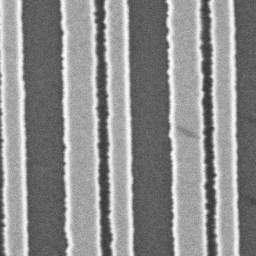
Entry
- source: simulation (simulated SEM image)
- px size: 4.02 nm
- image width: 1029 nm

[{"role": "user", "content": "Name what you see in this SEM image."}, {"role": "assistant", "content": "lines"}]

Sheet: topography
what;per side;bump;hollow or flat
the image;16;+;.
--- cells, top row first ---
+...++++...++++.
+...++++...++++.
+...++++...++++.
+...++++...++++.
+...++++...++++.
+...++++...++++.
+...++++...++++.
+...++++...++++.
++..++++...++++.
++..++++...++++.
++..++++...++++.
++..++++...++++.
++..++++...++++.
++..++++...++++.
++..++++...++++.
++..++++...++++.